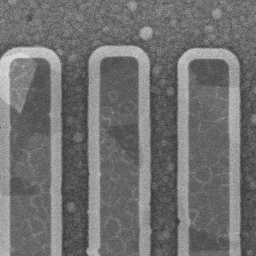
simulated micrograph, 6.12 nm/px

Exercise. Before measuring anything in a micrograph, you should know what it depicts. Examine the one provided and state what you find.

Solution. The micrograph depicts one or a few lines or trenches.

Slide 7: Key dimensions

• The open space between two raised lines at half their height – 0.226 micrometres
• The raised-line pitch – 547 nm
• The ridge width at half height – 0.325 um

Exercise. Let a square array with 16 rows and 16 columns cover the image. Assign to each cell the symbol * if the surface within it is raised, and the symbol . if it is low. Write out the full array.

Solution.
................
................
................
.**...***...**..
***...***..****.
****..***..****.
****..***..****.
****..***..****.
****..***..****.
****..***..****.
****..***..****.
****..***..****.
****..***..****.
****..***..****.
****..***..****.
****..***..****.